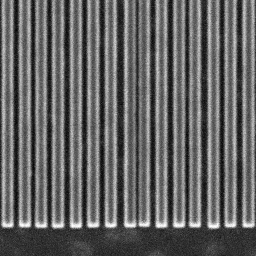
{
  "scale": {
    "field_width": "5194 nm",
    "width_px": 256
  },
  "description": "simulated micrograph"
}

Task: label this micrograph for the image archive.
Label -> parallel lines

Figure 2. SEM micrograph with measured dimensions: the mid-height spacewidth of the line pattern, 155 nanometres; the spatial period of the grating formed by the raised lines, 350 nm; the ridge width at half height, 198 nm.